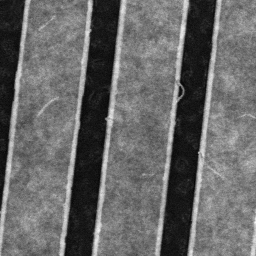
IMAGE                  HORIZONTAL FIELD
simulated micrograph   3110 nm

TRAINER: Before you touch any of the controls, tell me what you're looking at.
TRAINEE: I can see one or a few lines or trenches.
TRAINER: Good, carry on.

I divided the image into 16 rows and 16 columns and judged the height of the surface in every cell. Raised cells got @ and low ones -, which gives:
--@@@@--@@@@--@@
--@@@---@@@---@@
-@@@@--@@@@--@@@
-@@@@--@@@@--@@@
-@@@@--@@@@--@@@
-@@@@--@@@@--@@@
-@@@@--@@@@--@@@
-@@@@--@@@@--@@@
-@@@@--@@@@--@@@
-@@@@--@@@@--@@@
-@@@---@@@---@@@
@@@@--@@@@--@@@@
@@@@--@@@@--@@@@
@@@@--@@@@--@@@@
@@@@--@@@@--@@@@
@@@@--@@@@--@@@@